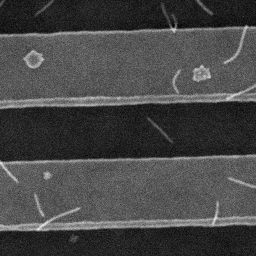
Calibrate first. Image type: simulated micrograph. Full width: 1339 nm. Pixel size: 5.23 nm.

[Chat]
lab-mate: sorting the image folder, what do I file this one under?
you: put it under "lines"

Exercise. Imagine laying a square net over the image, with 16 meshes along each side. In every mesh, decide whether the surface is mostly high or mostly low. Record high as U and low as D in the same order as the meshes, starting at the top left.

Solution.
DDDDDDDDDDDDDDDD
DDDDDDDDDDDDDDDD
UUUUUUUUUUUUUUUU
UUUUUUUUUUUUUUUU
UUUUUUUUUUUUUUUU
UUUUUUUUUUUUUUUU
UUUUUUUUUDDDDDDD
DDDDDDDDDDDDDDDD
DDDDDDDDDDDDDDDD
DDDDDDDDDDDDDDDD
UUUUUUUUUUUUUUUU
UUUUUUUUUUUUUUUU
UUUUUUUUUUUUUUUU
UUUUUUUUUUUUUUUU
DDDDDDDDDDDDDDDD
DDDDDDDDDDDDDDDD